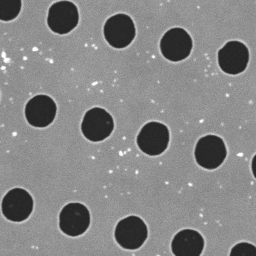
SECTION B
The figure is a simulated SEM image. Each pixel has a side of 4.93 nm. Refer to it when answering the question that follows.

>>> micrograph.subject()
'a regular array of holes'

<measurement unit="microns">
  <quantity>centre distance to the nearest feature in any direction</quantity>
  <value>0.288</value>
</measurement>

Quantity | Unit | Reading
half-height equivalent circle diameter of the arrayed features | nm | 163